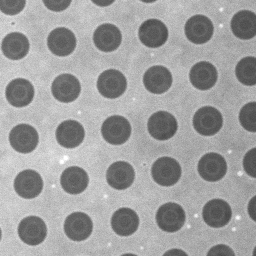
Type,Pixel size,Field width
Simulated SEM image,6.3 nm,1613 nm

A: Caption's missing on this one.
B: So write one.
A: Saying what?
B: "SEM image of an array of small figures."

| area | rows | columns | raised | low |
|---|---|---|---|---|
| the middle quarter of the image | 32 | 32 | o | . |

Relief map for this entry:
oooooooooooooooooooooo...ooooooo
oooooooooo....oooooo......ooooo.
..ooooooo......ooooo..ooo..oooo.
...ooooo...oo...oooo..ooo..oooo.
o...oooo..oooo..oooo..ooo..oooo.
oo..oooo..oooo..oooo...o...ooooo
oo..oooo...oo...ooooo.....oooooo
o...ooooo......ooooooo...ooooooo
...ooooooo....oooooooooooooooooo
..oooooooooooooooooooooooooooooo
oooooooooooooooooooooooooooooooo
oooooooooooooooooooooooo.ooooooo
oooooooooooooooooooooo.....ooooo
ooooooooooo.....ooooo.......oooo
....oooooo.......oooo..ooo..oooo
.....oooo..oooo..oooo..ooo...ooo
ooo..oooo..oooo..oooo..ooo..oooo
ooo..oooo...oo...oooo.......oooo
ooo..ooooo......oooooo.....ooooo
.....ooooo......oooooooooooooooo
....oooooooooooooooooooooooooooo
oooooooooooooooooooooooooooooooo
oooooooooooooooooooooooooooooooo
ooooooooooooooooooooooo.....oooo
oooooooooooo....oooooo.......ooo
oo..ooooooo......ooooo..ooo..ooo
.....oooooo..oo...oooo..ooo...oo
..o...oooo..oooo..oooo..ooo..ooo
.ooo..oooo..oooo..oooo...o...ooo
.ooo..ooooo..oo...ooooo.....oooo
..oo..ooooo......ooooooo...ooooo
.....oooooooo..ooooooooooooooooo